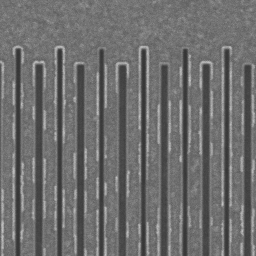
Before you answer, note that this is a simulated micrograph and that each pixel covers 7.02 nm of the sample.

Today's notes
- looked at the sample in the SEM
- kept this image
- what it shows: parallel lines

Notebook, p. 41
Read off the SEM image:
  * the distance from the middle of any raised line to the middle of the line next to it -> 146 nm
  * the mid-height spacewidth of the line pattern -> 0.0351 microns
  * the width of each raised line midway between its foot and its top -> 105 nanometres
